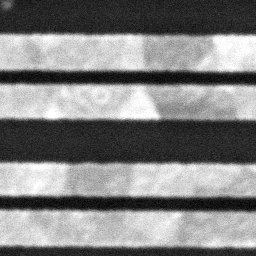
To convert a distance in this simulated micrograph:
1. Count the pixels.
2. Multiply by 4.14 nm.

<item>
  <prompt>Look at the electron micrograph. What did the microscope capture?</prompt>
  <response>lines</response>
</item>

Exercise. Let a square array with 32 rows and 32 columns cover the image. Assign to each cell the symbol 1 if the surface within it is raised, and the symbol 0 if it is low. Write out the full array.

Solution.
00000000000000000000000000000000
00000000000000000000000000000000
00000000000000000000000000000000
00000000000000000000000000000000
10101010110000101000000000000000
11111111111111111111111111111111
11111111111111111111111111111111
11111111111111111111111111111111
11111111111111111111111111111111
00000000000000000000000000000000
00000000000000000000000000000000
11111111111111111111111111111111
11111111111111111111111111111111
11111111111111111111111111111111
11111111111111111111111111111111
00000000000000000000000000000000
00000000000000000000000000000000
00000000000000000000000000000000
00000000000000000000000000000000
00000000000000000000000000000000
00000000000000000000000000000000
11111111111111111111111111111111
11111111111111111111111111111111
11111111111111111111111111111111
00000000000000000001110111100111
00000000000000000000000000000000
11111111111101011010000000000000
11111111111111111111111111111111
11111111111111111111111111111111
11111111111111111111111111111111
11111111111111111111111111111111
00000000000000000000000000000000